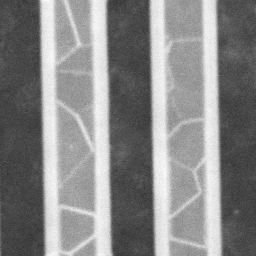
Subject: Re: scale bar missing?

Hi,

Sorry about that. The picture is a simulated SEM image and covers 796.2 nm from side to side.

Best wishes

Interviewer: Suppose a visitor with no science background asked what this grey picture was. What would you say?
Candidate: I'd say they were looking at one or a few lines or trenches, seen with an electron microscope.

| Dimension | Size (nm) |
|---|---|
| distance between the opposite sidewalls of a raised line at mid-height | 163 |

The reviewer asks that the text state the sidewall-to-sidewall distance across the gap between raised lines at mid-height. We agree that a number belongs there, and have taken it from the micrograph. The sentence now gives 178 nm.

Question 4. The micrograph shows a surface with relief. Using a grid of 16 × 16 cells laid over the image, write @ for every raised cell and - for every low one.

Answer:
---@@@----@@@---
---@@@----@@@---
---@@@----@@@---
---@@@----@@@---
---@@@----@@@---
---@@@----@@@---
---@@@----@@@---
---@@@----@@@---
---@@@----@@@---
---@@@----@@@---
---@@@----@@@---
---@@@----@@@---
---@@@----@@@---
---@@@----@@@---
---@@@----@@@---
---@@@----@@@---